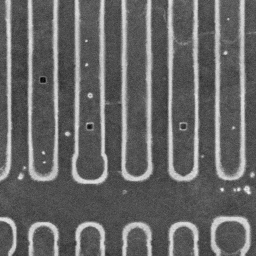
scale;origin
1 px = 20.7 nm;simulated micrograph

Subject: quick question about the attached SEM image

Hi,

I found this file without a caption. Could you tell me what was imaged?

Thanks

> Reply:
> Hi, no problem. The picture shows wiring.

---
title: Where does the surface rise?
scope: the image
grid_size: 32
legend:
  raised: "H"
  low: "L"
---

HLLLHHHLLLHHHLLLHHHLLHHHLLLHHHLL
HLLLHHHLLLHHHLLLHHHLLHHHLLLHHHLL
HLLLHHHLLLHHHLLLHHHLLHHHLLLHHHLL
HLLLHHHLLLHHHLLLHHHLLHHHLLLHHHLL
HLLLHHHLLLHHHLLLHHHLLHHHLLLHHHLL
HLLLHHHLLLHHHLLLHHHLLHHHLLLHHHLL
HLLLHHHLLLHHHLLLHHHLLHHHLLLHHHLL
HLLLHHHLLLHHHLLLHHHLLHHHLLLHHHLL
HLLLHHHLLLHHHLLLHHHLLHHHLLLHHHLL
HLLLHHHLLLHHHLLLHHHLLHHHLLLHHHLL
HLLLHHHLLLHHHLLLHHHLLHHHLLLHHHLL
HLLLHHHLLLHHHLLLHHHLLHHHLLLHHHLL
HLLLHHHLLLHHHLLLHHHLLHHHLLLHHHLL
HLLLHHHLLLHHHLLLHHHLLHHHLLLHHHLL
HLLLHHHLLLHHHLLLHHHLLHHHLLLHHHLL
HLLLHHHLLLHHHLLLHHHLLHHHLLLHHHLL
HLLLHHHLLLHHHLLLHHHLLHHHLLLHHHLL
HLLLHHHLLLHHHLLLHHHLLHHHLLLHHHLL
HLLLHHHLLLHHHLLLHHHLLHHHLLLHHHLL
HLLLHHHLLHHHHLLLHHHLLHHHLLLHHHLL
HLLLHHHLLHHHHLLHHHHLLHHHLLLHHHLL
HLLLHHHLLHHHHLLHHHHLLLHHLLLLHHLL
LLLLLLLLLLHHHLLLLLLLLLLLLLLLLLLL
LLLLLLLLLLLLLLLLLLLLLLLLLLLLLLLL
LLLLLLLLLLLLLLLLLLLLLLLLLLLLLLLL
LLLLLLLLLLLLLLLLLLLLLLLLLLLLLLLL
LLLLLLLLLLLLLLLLLLLLLLLLLLLLLLLL
HLLLLLLLLLLLLLLLLLLLLLLLLLLLHHLL
HHLLHHHLLLHHLLLLHHLLLLHHLLLHHHHL
HHLLHHHLLLHHHLLLHHHLLHHHLLLHHHHL
HHLLHHHLLLHHHLLLHHHLLHHHLLLHHHHL
HHLLHHHLLLHHHLLLHHHLLHHHLLLHHHHL